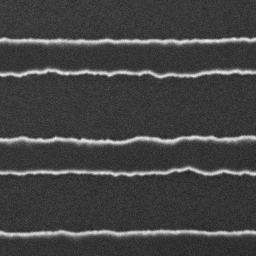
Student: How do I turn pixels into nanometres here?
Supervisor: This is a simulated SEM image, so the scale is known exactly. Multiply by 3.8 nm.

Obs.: lines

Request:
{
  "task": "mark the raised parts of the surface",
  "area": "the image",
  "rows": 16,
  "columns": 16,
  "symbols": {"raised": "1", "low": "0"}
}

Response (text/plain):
0000000000000000
0000000000000000
1000000000000011
1111111111111111
1111111111111111
0000000000000000
0000000000000000
0000000000000000
0000000000000000
1111111111111111
1111111111111111
0000000000000000
0000000000000000
0000000000000000
0000001001111001
1111111111111111